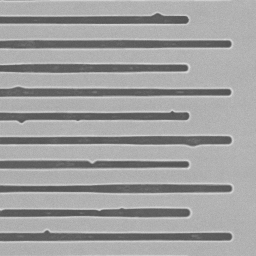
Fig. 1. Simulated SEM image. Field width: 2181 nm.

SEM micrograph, parallel lines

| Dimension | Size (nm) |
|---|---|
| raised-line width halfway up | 138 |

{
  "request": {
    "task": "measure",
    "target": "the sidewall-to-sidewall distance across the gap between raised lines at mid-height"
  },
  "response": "66.1 nm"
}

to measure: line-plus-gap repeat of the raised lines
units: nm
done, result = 206